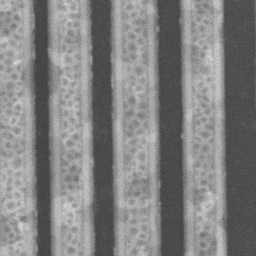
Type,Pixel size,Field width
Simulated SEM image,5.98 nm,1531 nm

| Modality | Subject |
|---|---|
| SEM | one or a few lines or trenches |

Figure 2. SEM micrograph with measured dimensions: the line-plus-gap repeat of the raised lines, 398 nanometers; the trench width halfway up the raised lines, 206 nm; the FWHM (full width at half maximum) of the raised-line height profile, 0.176 um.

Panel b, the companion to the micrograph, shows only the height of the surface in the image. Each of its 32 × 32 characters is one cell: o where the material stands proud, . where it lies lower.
ooo....ooo.....oooo....oooo.....
ooo....ooo.....oooo....oooo.....
ooo....ooo.....oooo....oooo.....
ooo....ooo.....oooo....oooo.....
ooo....ooo.....oooo.....ooo.....
ooo....ooo.....oooo.....ooo.....
ooo....ooo.....oooo.....ooo.....
ooo....ooo.....oooo.....ooo.....
ooo....oooo....oooo.....ooo.....
ooo....oooo....oooo.....ooo.....
ooo....oooo....oooo.....ooo.....
ooo....ooo.....oooo.....ooo.....
ooo....ooo.....oooo.....ooo.....
ooo....ooo.....oooo.....ooo.....
oooo...oooo....oooo.....ooo.....
oooo...oooo....oooo.....ooo.....
oooo...oooo....oooo.....ooo.....
ooo....oooo....oooo.....ooo.....
ooo....oooo....oooo.....ooo.....
oooo...oooo....oooo.....ooo.....
oooo...oooo....oooo.....ooo.....
oooo...oooo....oooo.....ooo.....
oooo...oooo....oooo.....ooo.....
oooo...oooo....oooo.....ooo.....
oooo...oooo....oooo.....ooo.....
oooo...oooo....oooo.....ooo.....
oooo...oooo....oooo.....ooo.....
oooo...oooo....oooo.....ooo.....
oooo...oooo....oooo.....ooo.....
oooo...oooo....oooo.....ooo.....
oooo...oooo....oooo.....ooo.....
oooo...oooo....oooo.....ooo.....